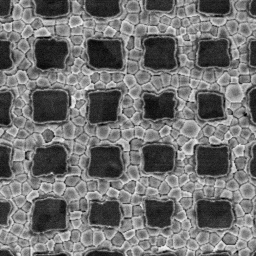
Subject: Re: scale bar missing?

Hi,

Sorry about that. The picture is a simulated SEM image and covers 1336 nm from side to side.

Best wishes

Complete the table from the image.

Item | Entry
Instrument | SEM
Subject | a regular array of raised bodies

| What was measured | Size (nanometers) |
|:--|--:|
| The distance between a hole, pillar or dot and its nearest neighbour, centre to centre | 273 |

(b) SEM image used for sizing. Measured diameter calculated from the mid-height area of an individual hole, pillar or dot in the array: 185 nanometers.